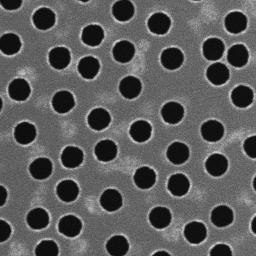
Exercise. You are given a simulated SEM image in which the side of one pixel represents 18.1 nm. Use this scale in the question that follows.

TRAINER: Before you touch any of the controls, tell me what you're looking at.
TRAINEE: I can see a regular array of holes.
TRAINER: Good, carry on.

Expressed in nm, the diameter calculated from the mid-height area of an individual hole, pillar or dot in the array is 419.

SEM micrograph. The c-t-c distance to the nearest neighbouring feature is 602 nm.